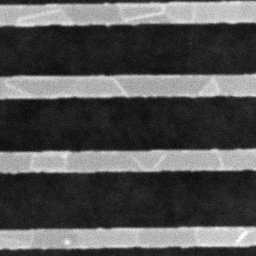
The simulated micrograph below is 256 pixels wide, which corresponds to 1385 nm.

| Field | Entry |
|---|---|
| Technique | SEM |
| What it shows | lines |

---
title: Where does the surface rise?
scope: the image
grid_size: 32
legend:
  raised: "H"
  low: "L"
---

LLLLLLLLLLLLLHHHHHHHHHHHHHHHHHHH
HHHHHHHHHHHHHHHHHHHHHHHHHHHHHHHH
HHHHHHHHHHHHHHHHHHHHHHHHHHHHHHHH
LLLLLLLLLLLLLLLLLLLLLLLLLLLLLLLL
LLLLLLLLLLLLLLLLLLLLLLLLLLLLLLLL
LLLLLLLLLLLLLLLLLLLLLLLLLLLLLLLL
LLLLLLLLLLLLLLLLLLLLLLLLLLLLLLLL
LLLLLLLLLLLLLLLLLLLLLLLLLLLLLLLL
LLLLLLLLLLLLLLLLLLLLLLLLLLLLLLLL
LLLLLLLLLLLLLLHHHHHHHHHHHHHHHHHH
HHHHHHHHHHHHHHHHHHHHHHHHHHHHHHHH
HHHHHHHHHHHHHHHHHHHHHHHHHHHHHHHH
LLLLLLLLLLLLLLLLLLLLLLLLLLLLLLLL
LLLLLLLLLLLLLLLLLLLLLLLLLLLLLLLL
LLLLLLLLLLLLLLLLLLLLLLLLLLLLLLLL
LLLLLLLLLLLLLLLLLLLLLLLLLLLLLLLL
LLLLLLLLLLLLLLLLLLLLLLLLLLLLLLLL
LLLLLLLLLLLLLLLLLLLLLLLLLLLLLLLL
LLLLLLLLLLLLLLLLLLLLLLLLLLLLLLLL
HHHHHHHHHHHHHHHHHHHHHHHHHHHHHHHH
HHHHHHHHHHHHHHHHHHHHHHHHHHHHHHHH
HHLLLLLLLLLLLLLLLLLLLLLLLLLLLLLL
LLLLLLLLLLLLLLLLLLLLLLLLLLLLLLLL
LLLLLLLLLLLLLLLLLLLLLLLLLLLLLLLL
LLLLLLLLLLLLLLLLLLLLLLLLLLLLLLLL
LLLLLLLLLLLLLLLLLLLLLLLLLLLLLLLL
LLLLLLLLLLLLLLLLLLLLLLLLLLLLLLLL
LLLLLLLLLLLLLLLLLLLLLLLLLLLLLLLL
LLLLLLLLLLLLLLLLLLLLLLHHHHHHHHHH
HHHHHHHHHHHHHHHHHHHHHHHHHHHHHHHH
HHHHHHHHHHHHHHHHHHHHHHHHHHHHHHHH
LLLLLLLLLLLLLLLLLLLLLLLLLLLLLLLL